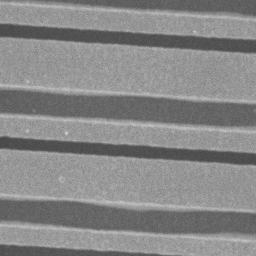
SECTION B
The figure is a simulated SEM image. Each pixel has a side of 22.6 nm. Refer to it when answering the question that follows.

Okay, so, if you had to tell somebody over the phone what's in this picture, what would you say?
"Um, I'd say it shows lines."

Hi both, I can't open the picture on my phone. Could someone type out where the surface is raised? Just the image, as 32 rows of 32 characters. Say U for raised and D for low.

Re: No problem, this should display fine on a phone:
UUUUDDDDDDDDDDDDDDDDDDDDDDDDDDDD
UUUUUUUUUUUUUUUUUUUDDDDDDDDDDDDD
UUUUUUUUUUUUUUUUUUUUUUUUUUUUUUUU
DDDDDDDDDDUUUUUUUUUUUUUUUUUUUUUU
DDDDDDDDDDDDDDDDDDDDDDDDDUUUUUUU
UUUUUUUUUUUDDDDDDDDDDDDDDDDDDDDD
UUUUUUUUUUUUUUUUUUUUUUUUUUUUDDDD
UUUUUUUUUUUUUUUUUUUUUUUUUUUUUUUU
UUUUUUUUUUUUUUUUUUUUUUUUUUUUUUUU
UUUUUUUUUUUUUUUUUUUUUUUUUUUUUUUU
UUUUUUUUUUUUUUUUUUUUUUUUUUUUUUUU
DDDDDDDDDDDUUUUUUUUUUUUUUUUUUUUU
DDDDDDDDDDDDDDDDDDDDDDDDDDDDUUUU
DDDDDDDDDDDDDDDDDDDDDDDDDDDDDDDD
UUDDDDDDDDDDDDDDDDDDDDDDDDDDDDDD
UUUUUUUUUUUUUUUUUDDDDDDDDDDDDDDD
UUUUUUUUUUUUUUUUUUUUUUUUUUUUUUUU
DDDDDDDUUUUUUUUUUUUUUUUUUUUUUUUU
DDDDDDDDDDDDDDDDDDDDDDDUUUUUUUUU
UUUUUUUUUUUUDDDDDDDDDDDDDDDDDDDD
UUUUUUUUUUUUUUUUUUUUUUUUUUUUDDDD
UUUUUUUUUUUUUUUUUUUUUUUUUUUUUUUU
UUUUUUUUUUUUUUUUUUUUUUUUUUUUUUUU
UUUUUUUUUUUUUUUUUUUUUUUUUUUUUUUU
UUUUUUUUUUUUUUUUUUUUUUUUUUUUUUUU
DDDDDDDDDDDDDDDUUUUUUUUUUUUUUUUU
DDDDDDDDDDDDDDDDDDDDDDDDDDDDDDDD
DDDDDDDDDDDDDDDDDDDDDDDDDDDDDDDD
UUUUUUUDDDDDDDDDDDDDDDDDDDDDDDDD
UUUUUUUUUUUUUUUUUUUUUUUDDDDDDDDD
UUUUUUUUUUUUUUUUUUUUUUUUUUUUUUUU
DDDDDDDDDDDDDDDDDDUUUUUUUUUUUUUU